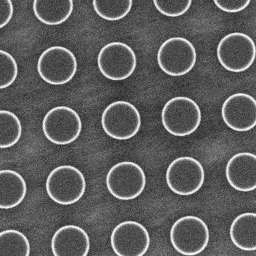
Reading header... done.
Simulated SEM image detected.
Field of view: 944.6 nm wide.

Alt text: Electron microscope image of an array of small figures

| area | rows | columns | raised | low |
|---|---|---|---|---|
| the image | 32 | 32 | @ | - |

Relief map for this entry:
@---@@@@@---@@@@---@@@@@---@@@@-
@@--@@@@@---@@@@----@@@---------
@----@@@------------------------
--------------------------------
----------------------------@@@-
--------------@-----@@@@---@@@@@
@-----@@@----@@@@---@@@@---@@@@@
@@---@@@@---@@@@@---@@@@---@@@@@
@@---@@@@---@@@@@---@@@@----@@@-
@@---@@@@----@@@----------------
@-------------------------------
--------------------------------
---------------------@@@----@@@@
-------@-----@@@@----@@@@---@@@@
@@----@@@@---@@@@---@@@@@---@@@@
@@---@@@@@---@@@@---@@@@@---@@@@
@@@---@@@@---@@@@----@@@--------
@@----@@@-----------------------
--------------------------------
-----------------------------@@@
---------------@@----@@@@----@@@
@@-----@@@----@@@@---@@@@---@@@@
@@@---@@@@---@@@@@---@@@@----@@@
@@@---@@@@@---@@@@---@@@@----@@@
@@@---@@@@----@@@---------------
@@------------------------------
--------------------------------
----------------------@@@----@@@
--------@@----@@@@----@@@@---@@@
@@@----@@@@---@@@@@--@@@@@---@@@
@@@@--@@@@@---@@@@@---@@@@---@@@
@@@@---@@@@---@@@@-----@@-------